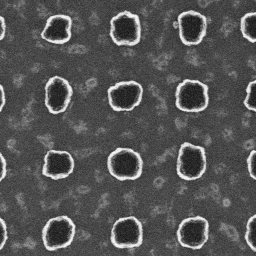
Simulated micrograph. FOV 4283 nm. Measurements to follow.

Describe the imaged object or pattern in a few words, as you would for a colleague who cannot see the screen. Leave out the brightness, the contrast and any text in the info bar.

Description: a regular array of raised bodies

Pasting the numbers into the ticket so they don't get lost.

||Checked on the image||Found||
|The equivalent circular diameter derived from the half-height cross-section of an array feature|30.9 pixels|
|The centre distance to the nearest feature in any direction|66.3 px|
